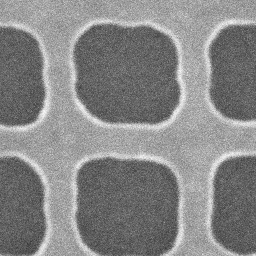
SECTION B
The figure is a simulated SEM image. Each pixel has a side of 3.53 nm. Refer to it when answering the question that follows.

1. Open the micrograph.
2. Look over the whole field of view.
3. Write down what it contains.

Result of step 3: holes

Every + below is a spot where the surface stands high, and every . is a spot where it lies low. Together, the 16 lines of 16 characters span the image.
++++++++++++++++
++++++.++++++++.
..+++......++...
...++......++...
...++......++...
...++......++...
...++......++...
..++++....+++++.
++++++++++++++++
++++++++++++++++
..+++......+++..
...++......++...
...++......++...
...++......++...
...++......++...
...++......+++..